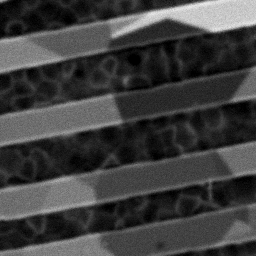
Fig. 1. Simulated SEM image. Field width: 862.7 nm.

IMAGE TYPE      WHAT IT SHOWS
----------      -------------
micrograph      one or a few lines or trenches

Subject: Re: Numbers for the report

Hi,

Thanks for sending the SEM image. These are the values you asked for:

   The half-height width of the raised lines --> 97.6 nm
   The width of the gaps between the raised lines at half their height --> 146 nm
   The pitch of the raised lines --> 242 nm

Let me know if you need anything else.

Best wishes